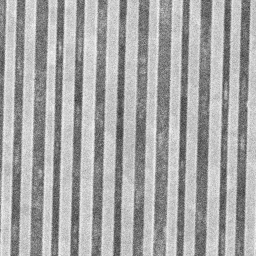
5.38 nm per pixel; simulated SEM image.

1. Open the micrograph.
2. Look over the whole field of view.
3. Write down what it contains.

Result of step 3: parallel lines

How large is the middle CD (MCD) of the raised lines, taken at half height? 0.0544 µm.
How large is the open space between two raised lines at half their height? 54.4 nanometres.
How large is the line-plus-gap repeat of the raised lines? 110 nm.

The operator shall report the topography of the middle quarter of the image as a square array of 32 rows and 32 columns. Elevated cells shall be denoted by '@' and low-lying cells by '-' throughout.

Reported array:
@@---@@@---@@---@@---@@----@@--@
@@---@@@---@@---@@---@@----@@--@
@@---@@@---@@---@@---@@----@@--@
@@---@@@---@@---@@---@@----@@--@
@@---@@@---@@--@@@---@@----@@--@
@@---@@@---@@--@@@---@@----@@--@
@@---@@@---@@--@@@---@@----@@--@
@@---@@@---@@--@@@---@@----@@--@
@@---@@@---@@--@@@---@@----@@--@
@@---@@---@@@--@@@---@@----@@--@
@@---@@---@@@--@@@---@@----@@--@
@@---@@---@@@--@@@---@@----@@--@
@@---@@---@@@--@@@---@@----@@--@
@@---@@---@@@--@@@---@@----@@--@
@@---@@---@@@--@@@---@@----@@--@
@@---@@---@@@--@@@---@@----@@--@
@@---@@---@@@--@@@---@@---@@@--@
@@---@@---@@@--@@@---@@---@@@--@
@@---@@---@@@--@@@---@@---@@@--@
@@---@@---@@@--@@@---@@---@@@--@
@@---@@---@@@--@@@---@@---@@---@
@@---@@---@@@--@@@---@@---@@---@
@@---@@---@@@--@@@---@@---@@---@
@@---@@---@@@--@@@---@@---@@---@
@@---@@---@@@--@@@---@@---@@---@
@@---@@---@@@--@@---@@@---@@---@
@@---@@---@@@--@@---@@@---@@---@
@@--@@@---@@@--@@---@@@---@@---@
@@--@@@---@@@--@@---@@----@@---@
@@--@@@---@@@--@@---@@----@@---@
@@--@@@---@@@--@@---@@----@@---@
@@--@@@---@@---@@---@@----@@---@